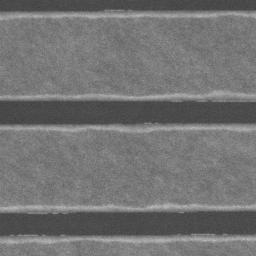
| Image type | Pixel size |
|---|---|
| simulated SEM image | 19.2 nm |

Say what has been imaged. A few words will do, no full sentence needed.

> lines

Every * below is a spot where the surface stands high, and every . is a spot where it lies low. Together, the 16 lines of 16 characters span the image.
................
****************
****************
****************
****************
****************
................
................
****************
****************
****************
****************
****************
................
................
****************